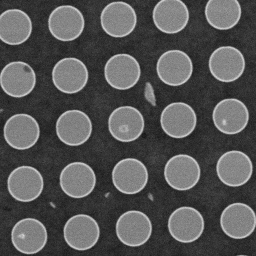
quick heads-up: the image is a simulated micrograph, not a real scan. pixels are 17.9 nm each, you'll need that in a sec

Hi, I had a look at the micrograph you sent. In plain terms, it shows an array of small figures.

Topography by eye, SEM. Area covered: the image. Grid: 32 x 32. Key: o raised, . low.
..............oo....ooo...oooo..
.oo....ooo...oooo..oooo...oooo..
oooo..oooo...oooo..oooo...oooo..
oooo..oooo...oooo...ooo....oo...
oooo...ooo....oo................
.o..............................
.....................oo....ooo..
........oo....ooo...oooo..oooo..
.ooo...oooo..oooo...oooo..oooo..
oooo...oooo..oooo...oooo...ooo..
oooo...oooo...ooo....oo.........
.ooo....oo......................
............................oo..
...............oo....ooo...oooo.
..oo....ooo...oooo..oooo...oooo.
.oooo..oooo...oooo..oooo...oooo.
.oooo..oooo...oooo...ooo....oo..
.oooo...ooo....oo...............
..o.............................
......................oo....ooo.
.........oo....ooo...oooo..oooo.
..ooo...oooo..oooo...oooo..oooo.
.oooo...oooo..oooo...oooo...ooo.
.oooo...oooo...ooo....oo........
..ooo....oo.....................
.............................o..
................o.....ooo...oooo
...o.....ooo...oooo..oooo...oooo
..oooo..oooo...oooo..oooo...oooo
.ooooo..oooo...oooo...ooo....oo.
..oooo...ooo....oo..............
...oo...........................